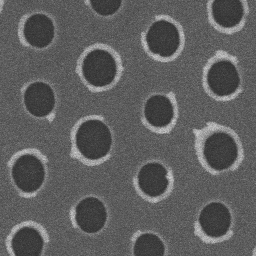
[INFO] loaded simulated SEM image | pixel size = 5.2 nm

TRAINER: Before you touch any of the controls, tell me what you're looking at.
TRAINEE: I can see a regular array of holes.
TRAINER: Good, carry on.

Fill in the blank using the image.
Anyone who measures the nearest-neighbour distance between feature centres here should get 0.358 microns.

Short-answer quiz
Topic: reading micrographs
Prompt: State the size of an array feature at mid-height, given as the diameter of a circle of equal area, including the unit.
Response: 0.18 micrometres